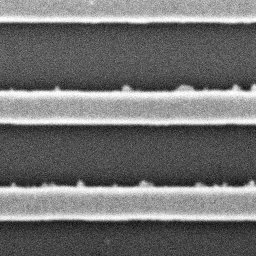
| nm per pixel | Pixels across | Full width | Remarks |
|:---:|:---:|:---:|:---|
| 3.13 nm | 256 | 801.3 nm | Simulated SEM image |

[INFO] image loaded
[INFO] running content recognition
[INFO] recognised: lines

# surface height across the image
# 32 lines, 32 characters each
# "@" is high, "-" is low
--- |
@@@@@@@@@@@@@@@@@@@@@@@@@@@@@@@@
@@@@@@@@@@@@@@@@@@@@@@@@@@@@@@@@
@@@@@@@@@@@@@@@@@@@@@@@@@@@@@@@@
--------------------------------
--------------------------------
--------------------------------
--------------------------------
--------------------------------
--------------------------------
--------------------------------
--------------------------------
@@@@@@@@@@------------@@@@@@@@@@
@@@@@@@@@@@@@@@@@@@@@@@@@@@@@@@@
@@@@@@@@@@@@@@@@@@@@@@@@@@@@@@@@
@@@@@@@@@@@@@@@@@@@@@@@@@@@@@@@@
--------------------------------
--------------------------------
--------------------------------
--------------------------------
--------------------------------
--------------------------------
--------------------------------
--------------------------------
@@@--@@@@@@@@@@@@@@@@@@@@@@@@@@@
@@@@@@@@@@@@@@@@@@@@@@@@@@@@@@@@
@@@@@@@@@@@@@@@@@@@@@@@@@@@@@@@@
@@@@@@@@@@@@@@@@@@@@@@@@@@@@@@@@
--------------------------------
--------------------------------
--------------------------------
--------------------------------
--------------------------------